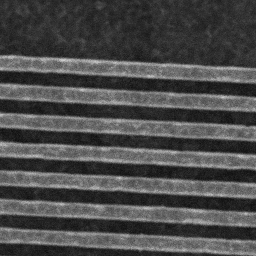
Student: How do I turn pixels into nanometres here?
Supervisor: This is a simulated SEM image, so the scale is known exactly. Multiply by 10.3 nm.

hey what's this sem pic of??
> parallel lines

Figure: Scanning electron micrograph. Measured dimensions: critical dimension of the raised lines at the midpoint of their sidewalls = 129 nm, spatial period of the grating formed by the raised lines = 0.295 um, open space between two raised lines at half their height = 164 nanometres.